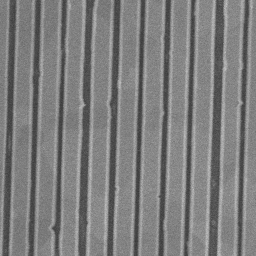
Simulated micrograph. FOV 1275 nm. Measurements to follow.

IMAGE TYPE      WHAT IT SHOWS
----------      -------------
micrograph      parallel lines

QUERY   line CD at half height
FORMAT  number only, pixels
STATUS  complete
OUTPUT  17.4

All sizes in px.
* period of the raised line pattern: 26.1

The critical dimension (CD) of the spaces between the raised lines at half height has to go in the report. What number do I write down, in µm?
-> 0.0411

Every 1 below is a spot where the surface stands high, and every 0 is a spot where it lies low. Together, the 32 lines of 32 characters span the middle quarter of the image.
01110001111000111100111100011110
01110001111000111100111100011110
01110001111000111100111100011110
01110001111000111100111100011110
01110001111000111100111100011110
01110001111000111100111110011110
11110001111000111100111100011110
11110001111000111100111100011110
11110001111000111100111100111110
11110001111000111100111100111110
11110001111000111100111100111110
11110001111000111100111110111110
11110001111000111100111110111100
11110001111000111100111100111100
11110001111000111100111100111100
11110001111000111100111100111100
11110001111000111100111100111100
11110001111000111100111100111100
11110001111000111100111100111100
11110001111000111100111100111100
11110001111000111100111100111100
11110001111000111100111100111100
11110001111000111100111100111100
11110001111001111100111100111100
11110001111001111100111100111100
11110001111001111100111100111100
11110001111001111100111100111100
11110001111001111000111100111100
11110011111001111000111100111100
11100011111001111001111100111100
11100011111001111001111100111100
11100011111001111001111100111100